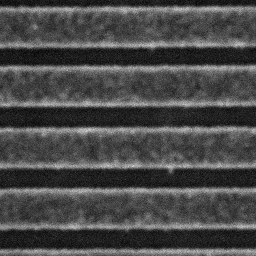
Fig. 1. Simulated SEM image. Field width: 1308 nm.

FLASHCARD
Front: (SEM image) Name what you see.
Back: lines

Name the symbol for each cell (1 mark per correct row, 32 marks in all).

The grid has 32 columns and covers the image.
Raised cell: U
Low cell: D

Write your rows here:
DDDDDDDDDDDDDDDDDDDDDDDDDDDDDDDD
UUUUUUUUUUUUUUUUUUUUUUUUUUUUUUUU
UUUUUUUUUUUUUUUUUUUUUUUUUUUUUUUU
UUUUUUUUUUUUUUUUUUUUUUUUUUUUUUUU
UUUUUUUUUUUUUUUUUUUUUUUUUUUUUUUU
UUUUUUUUUUUUUUUUUUUUUUUUUUUUUUUU
DDDDDDDDDDDDDDDDDDDDDDDDDDDDDDDD
DDDDDDDDDDDDDDDDDDDDDDDDDDDDDDDD
UUUUUUUUUUUUUUUUUUUUUUUUUUUUUUUU
UUUUUUUUUUUUUUUUUUUUUUUUUUUUUUUU
UUUUUUUUUUUUUUUUUUUUUUUUUUUUUUUU
UUUUUUUUUUUUUUUUUUUUUUUUUUUUUUUU
UUUUUUUUUUUUUUUUUUUUUUUUUUUUUUUU
DDDDDDDDDDDDDDDDDDDDDDDDDDDDDDDD
DDDDDDDDDDDDDDDDDDDDDDDDDDDDDDDD
DDDDDDDDDDDDDDDDDDDDDDDDDDDDDDDD
UUUUUUUUUUUUUUUUUUUUUUUUUUUUUUUU
UUUUUUUUUUUUUUUUUUUUUUUUUUUUUUUU
UUUUUUUUUUUUUUUUUUUUUUUUUUUUUUUU
UUUUUUUUUUUUUUUUUUUUUUUUUUUUUUUU
UUUUUUUUUUUUUUUUUUUUUUUUUUUUUUUU
DDDDDDDDDDDDDDDDDDDDDDDDDDDDDDDD
DDDDDDDDDDDDDDDDDDDDDDDDDDDDDDDD
DDDDDDDDDDDDDDDDDDDDDDDDDDDDDDDD
UUUUUUUUUUUUUUUUUUUUUUUUUUUUUUUU
UUUUUUUUUUUUUUUUUUUUUUUUUUUUUUUU
UUUUUUUUUUUUUUUUUUUUUUUUUUUUUUUU
UUUUUUUUUUUUUUUUUUUUUUUUUUUUUUUU
UDUDUDDUUUDDDDDDDDUDDDUDDDDDDDDD
DDDDDDDDDDDDDDDDDDDDDDDDDDDDDDDD
DDDDDDDDDDDDDDDDDDDDDDDDDDDDDDDD
UUUUUUUUUUUUUUUUUUUUUUUUUUUUUUUU